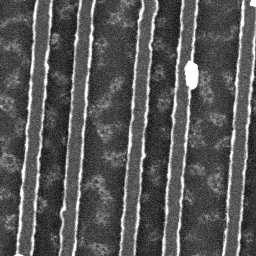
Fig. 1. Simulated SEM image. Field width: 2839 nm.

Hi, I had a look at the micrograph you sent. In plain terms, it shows parallel lines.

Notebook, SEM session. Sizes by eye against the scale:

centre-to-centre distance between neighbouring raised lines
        51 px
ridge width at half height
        169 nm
